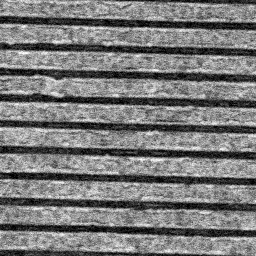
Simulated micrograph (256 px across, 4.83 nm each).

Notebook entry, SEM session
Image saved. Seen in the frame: parallel lines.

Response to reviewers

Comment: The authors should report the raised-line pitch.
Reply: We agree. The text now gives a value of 25.8 pixels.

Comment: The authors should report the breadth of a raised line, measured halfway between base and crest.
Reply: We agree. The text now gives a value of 90.5 nanometers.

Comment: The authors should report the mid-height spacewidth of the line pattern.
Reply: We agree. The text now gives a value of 7.49 pixels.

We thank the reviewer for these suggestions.